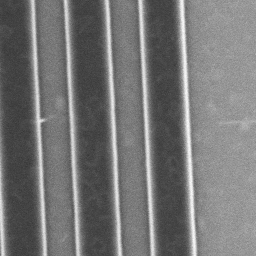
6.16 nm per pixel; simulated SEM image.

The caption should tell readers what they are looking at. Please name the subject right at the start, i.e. one or a few lines or trenches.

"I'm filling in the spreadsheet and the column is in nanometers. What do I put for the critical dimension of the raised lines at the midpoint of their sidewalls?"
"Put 267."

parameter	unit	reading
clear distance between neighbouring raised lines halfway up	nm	193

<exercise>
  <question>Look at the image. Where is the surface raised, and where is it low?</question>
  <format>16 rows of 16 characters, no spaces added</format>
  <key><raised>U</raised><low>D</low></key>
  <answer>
UUDDUUUDDUUDDDDD
UUDDUUUDDUUDDDDD
UUDDUUUDDUUUDDDD
UUDDUUUDDUUUDDDD
UUDDUUUDDUUUDDDD
UUDDUUUDDUUUDDDD
UUDDUUUDDUUUDDDD
UUDDUUUDDUUUDDDD
UUDDUUUDDUUUDDDD
UUUDDUUDDUUUDDDD
UUUDDUUDDUUUDDDD
UUUDDUUDDUUUDDDD
UUUDDUUDDUUUDDDD
UUUDDUUDDUUUDDDD
UUUDDUUDDUUUDDDD
UUUDDUUUDUUUDDDD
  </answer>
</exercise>